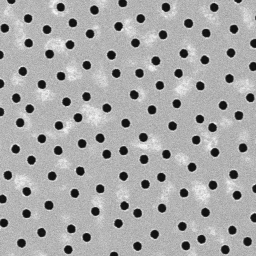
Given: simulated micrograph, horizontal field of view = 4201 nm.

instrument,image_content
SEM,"a regular array of holes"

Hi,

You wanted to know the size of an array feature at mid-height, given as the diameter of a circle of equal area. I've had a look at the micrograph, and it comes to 0.149 µm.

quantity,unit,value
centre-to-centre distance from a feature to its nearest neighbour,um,0.344